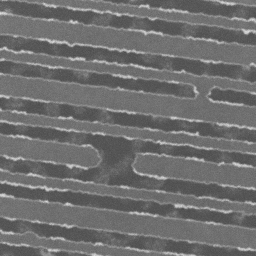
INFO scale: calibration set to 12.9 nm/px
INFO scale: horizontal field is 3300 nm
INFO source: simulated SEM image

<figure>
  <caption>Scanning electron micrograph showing parallel lines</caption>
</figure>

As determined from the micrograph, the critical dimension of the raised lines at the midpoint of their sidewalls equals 196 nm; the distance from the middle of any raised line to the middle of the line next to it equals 392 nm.